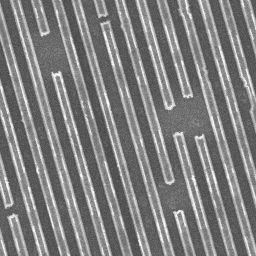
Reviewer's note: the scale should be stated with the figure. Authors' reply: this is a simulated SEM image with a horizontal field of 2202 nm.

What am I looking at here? parallel lines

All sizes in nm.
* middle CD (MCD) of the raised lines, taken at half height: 74.5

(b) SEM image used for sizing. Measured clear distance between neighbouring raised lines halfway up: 0.0994 microns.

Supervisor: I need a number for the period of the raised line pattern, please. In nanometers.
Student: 173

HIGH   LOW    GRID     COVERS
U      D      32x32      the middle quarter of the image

DDUUDDDUDDDDUUDDDUUUDDDUUDDDUUDD
DDUUDDDUUDDDUUUDDDUUDDDUUDDDUUDD
DDUUDDDUUDDDDUUDDDUUDDDUUDDDUUUD
DDDUUDDDUDDDDUUDDDUUDDDUUUDDDUUD
DDDUUDDDUUDDDUUDDDDUUDDDUUDDDUUD
DDDUUDDDUUDDDDUUDDDUUDDDUUDDDUUD
DDDUUUDDUUDDDDUUDDDUUDDDUUDDDDUU
UDDDUUDDDUDDDDUUDDDUUUDDDUUDDDUU
UDDDUUDDDUUDDDUUUDDDUUDDDUUDDDDD
UDDDUUDDDUUDDDDUUDDDUUDDDUUDDDDD
UDDDUUUDDUUDDDDUUDDDUUDDDUUDDDDD
UUDDDUUDDDUDDDDUUDDDUUUDDDDDDDDD
UUDDDUUDDDUUDDDDUUDDDUUDDDDDDDDD
UUDDDUUUDDUUDDDDUUDDDUUDDDDDDDDD
UUUDDDUUDDDUDDDDUUDDDUUDDDDDDDDD
DUUDDDUUDDDUUDDDUUUDDDUUDDDDDDDD
DUUDDDUUDDDUUDDDDUUDDDUUDDDDDDDD
DUUDDDUUUDDUUDDDDUUDDDUUDDDDUDDD
DUUUDDDUUDDDUDDDDUUDDDUUUDDDUUDD
DDUUDDDUUDDDUUDDDUUUDDDUUDDDUUDD
DDUUDDDUUDDDUUDDDDUUDDDUUDDDUUDD
DDUUUDDDUUDDDUDDDDUUDDDUUDDDUUUD
DDDUUDDDUUDDDUUDDDUUDDDDUUDDDUUD
DDDUUDDDUUDDDUUDDDDUUDDDUUDDDUUD
DDDUUDDDUUUDDUUDDDDUUDDDUUDDDUUD
DDDUUUDDDUUDDDUDDDDUUDDDUUUDDDUU
UDDDUUDDDUUDDDUUDDDUUUDDDUUDDDUU
UDDDUUDDDUUDDDUUDDDDUUDDDUUDDDUU
UDDDUUDDDDUUDDUUDDDDUUDDDUUDDDUU
UUDDDUUDDDUUDDDUDDDDUUDDDDUDDDDU
UUDDDUUDDDUUDDDUUDDDDUUDDDDDDDDU
UUDDDUUDDDUUUDDUUDDDDUUDDDDDDDDU